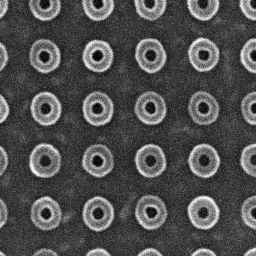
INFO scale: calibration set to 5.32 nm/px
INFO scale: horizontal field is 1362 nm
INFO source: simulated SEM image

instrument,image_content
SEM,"a regular array of ring-shaped raised bodies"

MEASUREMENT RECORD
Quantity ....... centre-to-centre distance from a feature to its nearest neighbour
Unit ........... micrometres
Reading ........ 0.278